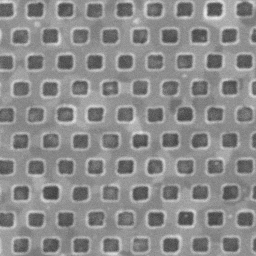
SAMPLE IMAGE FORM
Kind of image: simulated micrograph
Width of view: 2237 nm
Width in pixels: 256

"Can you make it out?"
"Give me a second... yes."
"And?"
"a regular array of holes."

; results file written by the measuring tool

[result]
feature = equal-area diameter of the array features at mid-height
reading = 157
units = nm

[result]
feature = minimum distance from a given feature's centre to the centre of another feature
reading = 0.258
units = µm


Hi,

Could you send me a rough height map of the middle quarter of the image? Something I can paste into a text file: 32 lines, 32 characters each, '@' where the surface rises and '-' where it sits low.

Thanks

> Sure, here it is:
--@@@-----@@@----@@@@----@@@----
--@@@@---@@@@@--@@@@@@@@@@@@@@@@
@@@@@@@@@@@@@@@@@@@@@@@@@@@@@@@@
@@@@@@@@@@@@@@@@@@@@@@@@@@@@@@@@
@@----@@@@----@@@----@@@@----@@@
@@----@@@-----@@@----@@@-----@@@
@@----@@@-----@@@----@@@-----@@@
@@----@@@@---@@@@----@@@@----@@@
@@@@@@@@@@@@@@@@@@@@@@@@@@@@@@@@
@@@@@@@@@@@@@@@@@@@@@@@@@@@@@@@@
@@@@@@@@@@@@@@@@@@@@@@@@@@@@@@@@
--@@@@----@@@----@@@@----@@@----
---@@@----@@@----@@@@----@@@----
---@@@----@@@-----@@@----@@@----
--@@@@--@@@@@@---@@@@---@@@@@---
@@@@@@@@@@@@@@@@@@@@@@@@@@@@@@@@
@@@@@@@@@@@@@@@@@@@@@@@@@@@@@@@@
@@@---@@@@---@@@@@---@@@@----@@@
@@----@@@-----@@@----@@@-----@@@
@@----@@@-----@@@----@@@-----@@@
@@----@@@-----@@@----@@@@----@@@
@@@@@@@@@@@@@@@@@@@@@@@@@@@@@@@@
@@@@@@@@@@@@@@@@@@@@@@@@@@@@@@@@
@@@@@@@@@@@@@@@@@@@@@@@@@@@@@@@@
---@@@----@@@@----@@@----@@@----
---@@@----@@@-----@@@----@@@----
---@@@----@@@-----@@@----@@@----
--@@@@---@@@@@-@@@@@@--@@@@@@---
@@@@@@@@@@@@@@@@@@@@@@@@@@@@@@@@
@@@@@@@@@@@@@@@@@@@@@@@@@@@@@@@@
@@@@@@@@@@---@@@@@---@@@@---@@@@
@@----@@@-----@@@----@@@-----@@@